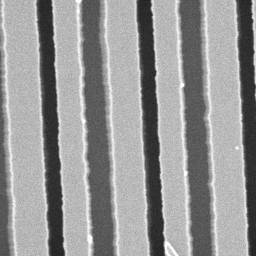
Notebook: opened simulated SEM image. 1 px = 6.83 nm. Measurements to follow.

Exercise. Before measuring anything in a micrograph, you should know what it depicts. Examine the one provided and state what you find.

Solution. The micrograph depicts lines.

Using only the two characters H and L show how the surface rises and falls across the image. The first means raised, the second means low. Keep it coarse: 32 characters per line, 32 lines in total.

HHHHHLLHHHLLLHHHHLLHHHLLLLHHHLLL
HHHHHLLHHHLLLHHHHLLHHHLLLLHHHHLL
HHHHHLLHHHLLLHHHHLLHHHLLLLHHHHLL
HHHHHLLHHHLLLHHHHLLHHHLLLLHHHHLL
HHHHHLLHHHLLLHHHHLLHHHHLLLHHHHLL
HHHHHLLHHHLLLHHHHLLHHHHLLLHHHHLL
LHHHHLLHHHLLLHHHHLLHHHHLLLHHHHLL
LHHHHLLHHHLLLHHHHLLHHHHLLLHHHHLL
LHHHHLLHHHLLLHHHHLLHHHHLLLHHHHLL
LHHHHLLHHHLLLHHHHHLHHHHLLLHHHHLL
LHHHHLLHHHLLLLHHHHLLHHHLLLHHHHLL
LHHHHLLHHHLLLLHHHHLLHHHLLLHHHHLL
LHHHHLLHHHLLLLHHHHLLHHHLLLHHHHLL
LHHHHLLHHHHLLLHHHHLLHHHLLLHHHHLL
LHHHHLLHHHHLLLHHHHLLHHHLLLHHHHLL
LHHHHLLHHHHLLLHHHHLLHHHLLLHHHHLL
LHHHHLLHHHHLLLHHHHLLHHHLLLHHHHLL
LHHHHLLHHHHLLLHHHHLLHHHLLLHHHHLL
LHHHHLLHHHHLLLHHHHLLHHHLLLHHHHLL
LHHHHLLHHHHLLLHHHHLLHHHLLLHHHHLL
LHHHHLLLHHHLLLHHHHLLHHHLLLHHHHHL
LHHHHHLLHHHLLLHHHHLLHHHLLLHHHHLL
LHHHHHLLHHHLLLHHHHLLHHHLLLHHHHHL
LHHHHHLLHHHLLLHHHHLLHHHHLLHHHHHL
LHHHHHLLHHHLLLHHHHLLHHHHLLLHHHHL
LLHHHHLLHHHLLLHHHHLLHHHHLLLHHHHL
LLHHHHLLHHHLLLHHHHLLHHHHLLLHHHHL
LLHHHHLLHHHLLLHHHHLLHHHHLLLHHHHL
LLHHHHLLHHHLLLLHHHLLLHHHLLLHHHHL
LLHHHHLLHHHLLLLHHHLLLHHHLLLHHHHL
LLHHHHLLHHHLLLLHHHHLLHHHLLLHHHHL
LLHHHHLLHHHLLLLHHHHLLHHHLLLHHHHL